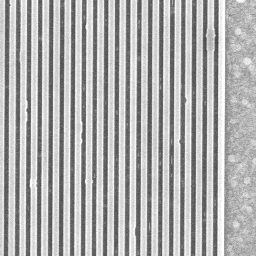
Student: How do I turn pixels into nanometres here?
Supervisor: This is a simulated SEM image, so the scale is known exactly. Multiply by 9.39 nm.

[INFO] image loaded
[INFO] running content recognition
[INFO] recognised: parallel lines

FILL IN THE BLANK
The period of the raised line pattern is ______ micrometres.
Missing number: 0.103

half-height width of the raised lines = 54 nm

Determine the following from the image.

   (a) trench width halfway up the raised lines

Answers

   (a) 52.8 nm